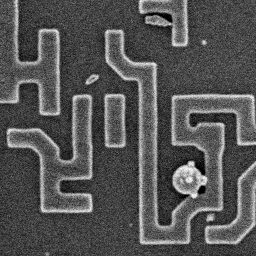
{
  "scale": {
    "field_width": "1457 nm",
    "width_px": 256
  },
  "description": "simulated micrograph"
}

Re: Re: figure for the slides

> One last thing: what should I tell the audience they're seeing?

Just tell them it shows wiring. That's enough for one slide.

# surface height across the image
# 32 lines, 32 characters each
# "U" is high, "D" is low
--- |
UUDDDDDDDDDDDDDDDDUUUUUDDDDDDDDD
UUDDDDDDDDDDDDDDDDUUUUUDDDDDDDDD
UUDDDDDDDDDDDDDDDDUUUDUDDDDDDDDD
UUDDDDDDDDDDDDDDDDDDDDUDDDDDDDDD
UUDDDUUDDDDDDUUDDDDDDDUDDDDDDDDD
UUDDDUUDDDDDDUUDDDDDDDUDDDDDDDDD
UUDDDUUDDDDDDUUDDDDDDDDDDDDDDDDD
UUDDDUUDDDDDDUUUDDDDDDDDDDDDDDDD
UUUUUUUDDDDDDDUUUUUDDDDDDDDDDDDD
UUUUUUUDDDDDDDDUUUUDDDDDDDDDDDDD
UUUDDUUDDDDDDDDDDUUDDDDDDDDDDDDD
UUDDDUUDDDDDDDDDDUUDDDDDDDDDDDDD
UUDDDUUDDUUDDUUDDUUDDDUUUUUUUUUU
DDDDDUUDDUUDDUUDDUUDDDUUUUUUUUUU
DDDDDDDDDUUDDUUDDUUUDDUUDDDDDDUU
DDDDDDDDDUUDDUUDDUUUDDUUDUUDDDUU
DUUUUDDDDUUDDUUUDUUUDDUUUUUUDDUU
DUUUUUDDDUUDDUUUDUUDDDUUUUUUDDUU
DDDDUUUDDUUDDDDDDUUUDDDDDUUUDDDD
DDDDDUUDDUUDDDDDDUUUDDDDDDUUDDDD
DDDDDUUUUUUDDDDDDUUDDDDUDDUUDDDD
DDDDDUUUUUUDDDDDDUUUDDUUUDUUDDDU
DDDDDUUUDDDDDDDDDDUUDDUUUUUUDDUU
DDDDDUUDDDDDDDDDDDUUDDUUUDUUDDUU
DDDDDUUUUUUDDDDDDDUUDDDUUUUUDDUU
DDDDDUUUUUUDDDDDDDUUDDDUUUUUDDUU
DDDDDDDDDDDDDDDDDDUUDDUUUDDDDDUU
DDDDDDDDDDDDDDDDDDUUDDUUDDDDDUUU
DDDDDDDDDDDDDDDDDDUUUUUUDDUUUUUD
DDDDDDDDDDDDDDDDDDUUUUUUDDUUUUDD
DDDDDDDDDDDDDDDDDDDDDDDDDDDDDDDD
DDDDDDDDDDDDDDDDDDDDDDDDDDDDDDDD